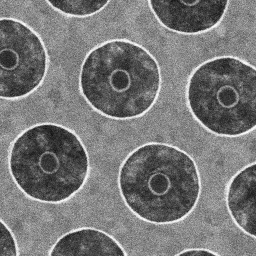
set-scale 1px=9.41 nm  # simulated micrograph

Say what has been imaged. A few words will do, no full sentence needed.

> ring-shaped grooves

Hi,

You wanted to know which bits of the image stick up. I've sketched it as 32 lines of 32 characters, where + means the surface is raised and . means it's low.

++++++.......++++++....+....++++
++++++++....+++++++.........++++
..++++++++++++++++++........++++
....+++++++++++++++++.....++++++
.....+++++++++++++++++++++++++++
.....++++++++....+++++++++++++++
++....+++++.......++++++++++++++
++....+++++........+++++++....++
.+....++++..........+++++.......
......++++....++....++++........
.....+++++....++....++++........
....++++++..........+++....+++..
+++++++++++........+++++...+++..
++++++++++++.......+++++........
+++++++++++++....+++++++........
+++++++++++++++++++++++++.......
+++......++++++++++++++++++....+
++........++++++++++++++++++++++
++........+++++++.....++++++++++
+....++....+++++........++++++++
+....++....++++.........++++++++
+.....+....++++..........+++++..
++.........++++....++....++++...
+++.......+++++....++....++++...
++++.....++++++..........+++....
++++++++++++++++........++++....
+++++++++++++++++.......+++++...
++++++++++++++++++....+++++++...
.+++++++++++++++++++++++++++++..
..++++++......++++++++++++++++++
..+++++........+++++++++++++++++
..++++.........++++++++...++++++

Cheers